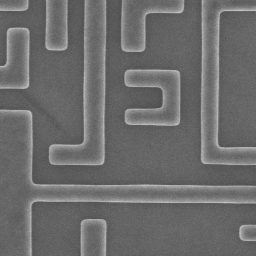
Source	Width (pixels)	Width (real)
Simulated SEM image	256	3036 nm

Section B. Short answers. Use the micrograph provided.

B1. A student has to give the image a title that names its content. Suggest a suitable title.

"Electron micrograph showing wiring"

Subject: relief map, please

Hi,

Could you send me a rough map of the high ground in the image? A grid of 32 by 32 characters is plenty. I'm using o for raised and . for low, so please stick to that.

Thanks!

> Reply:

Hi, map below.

oooo..oo...oo..oooooooo..ooooooo
......oo...oo..oooooooo..ooo....
......oo...oo..ooo.......oo.....
......oo...oo..ooo.......oo.....
.ooo..oo...oo..ooo.......oo.....
.ooo..oo...oo..ooo.......oo.....
.ooo.......oo............oo.....
.ooo.......oo............oo.....
oooo.......oo............oo.....
oooo.......oo...oooooo...oo.....
oooo......ooo...oooooo...oo.....
..........ooo.......oo...oo.....
..........ooo.......oo...oo.....
..........ooo.......oo...oo.....
oooo.......oo...oooooo...oo.....
oooo.......oo...oooooo...oo.....
oooo.......oo............oo.....
oooo......ooo............oo.....
oooo..ooooooo............ooooooo
oooo..ooooooo............ooooooo
oooo...oooooo...............oooo
oooo............................
oooo............................
oooooooooooooooooooooooooooooooo
oooooooooooooooooooooooooooooooo
oooo............................
oooo............................
oooo.......oo...................
oooo......ooo.................oo
oooo......ooo.................oo
oooo......ooo...................
oooo......ooo...................